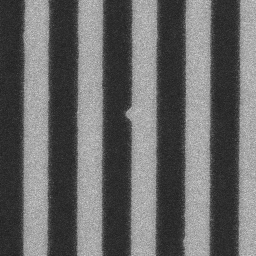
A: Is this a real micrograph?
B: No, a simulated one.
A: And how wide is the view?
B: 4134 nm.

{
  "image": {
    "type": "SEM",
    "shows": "parallel lines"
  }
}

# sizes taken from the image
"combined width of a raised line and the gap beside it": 871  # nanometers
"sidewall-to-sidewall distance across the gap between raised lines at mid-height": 375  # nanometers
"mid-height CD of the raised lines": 30.5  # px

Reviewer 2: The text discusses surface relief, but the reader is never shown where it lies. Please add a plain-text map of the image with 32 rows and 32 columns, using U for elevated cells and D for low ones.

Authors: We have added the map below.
UUUDDDUUUUDDDUUUUDDDUUUDDDUUUUDD
UUUDDDUUUUDDDUUUUDDDUUUDDDUUUUDD
UUUDDDUUUUDDDUUUUDDDUUUDDDUUUUDD
UUUDDDUUUUDDDUUUUDDDUUUDDDUUUUDD
UUUDDDUUUUDDDUUUUDDDUUUDDDUUUUDD
UUUDDDUUUUDDDUUUUDDDUUUDDDUUUUDD
UUUDDDUUUUDDDUUUUDDDUUUDDDUUUUDD
UUUDDDUUUUDDDUUUUDDDUUUDDDUUUUDD
UUUDDDUUUUDDDUUUUDDDUUUDDDUUUUDD
UUUDDDUUUUDDDUUUUDDDUUUDDDUUUUDD
UUUDDDUUUUDDDUUUUDDDUUUDDDUUUUDD
UUUDDDUUUUDDDUUUUDDDUUUDDDUUUUDD
UUUDDDUUUUDDDUUUUDDDUUUDDDUUUUDD
UUUDDDUUUUDDDUUUDDDDUUUDDDUUUUDD
UUUDDDUUUUDDDUUUDDDDUUUDDDUUUUDD
UUUDDDUUUUDDDUUUUDDDUUUDDDUUUUDD
UUUDDDUUUUDDDUUUUDDDUUUDDDUUUUDD
UUUDDDUUUUDDDUUUUDDDUUUDDDUUUUDD
UUUDDDUUUUDDDUUUDDDDUUUDDDUUUUDD
UUUDDDUUUUDDDUUUDDDDUUUDDDUUUUDD
UUUDDDUUUUDDDUUUDDDDUUUDDDUUUUDD
UUUDDDUUUUDDDUUUDDDDUUUDDDUUUUDD
UUUDDDUUUUDDDUUUDDDDUUUDDDUUUUDD
UUUDDDUUUUDDDUUUDDDUUUUDDDUUUUDD
UUUDDDUUUUDDDUUUDDDUUUUDDDUUUUDD
UUUDDDUUUUDDDUUUDDDUUUUDDDUUUUDD
UUUDDDUUUUDDDUUUDDDUUUUDDDUUUUDD
UUUDDDUUUUDDDUUUDDDUUUUDDDUUUUDD
UUUDDDUUUUDDDUUUDDDUUUUDDDUUUUDD
UUUDDDUUUUDDDUUUDDDUUUUDDDUUUUDD
UUUDDDUUUUDDDUUUDDDUUUUDDDUUUUDD
UUUDDDUUUUDDDUUUDDDUUUUDDDUUUUDD